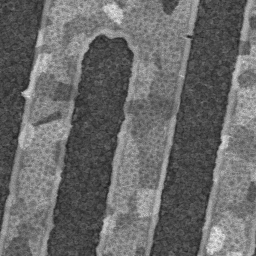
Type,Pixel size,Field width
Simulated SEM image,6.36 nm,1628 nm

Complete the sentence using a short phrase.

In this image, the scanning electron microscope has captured one or a few lines or trenches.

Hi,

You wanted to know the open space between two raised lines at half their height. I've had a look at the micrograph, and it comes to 338 nm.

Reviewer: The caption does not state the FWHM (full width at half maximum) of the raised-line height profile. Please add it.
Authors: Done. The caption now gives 0.301 micrometres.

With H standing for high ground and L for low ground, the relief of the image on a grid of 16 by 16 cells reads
LLLHHHHHHHHHLLLL
LLLHHHHHHHHHLLLH
LLHHHHLLHHHHLLLH
LLHHHLLLHHHHLLLH
LLHHHLLLHHHLLLLH
LLHHHLLLHHHLLLLH
LLHHLLLLHHHLLLHH
LLHHLLLLHHHLLLHH
LHHHLLLLHHHLLLHH
LHHHLLLHHHLLLLHH
LHHHLLLHHHLLLLHH
LHHHLLLHHHLLLHHH
LHHLLLLHHHLLLHHH
HHHLLLLHHHLLLHHH
HHHLLLHHHLLLLHHH
HHHLLLHHHLLLLHHH